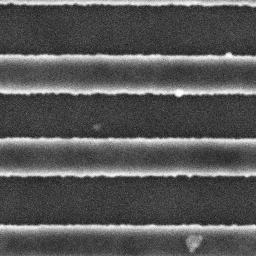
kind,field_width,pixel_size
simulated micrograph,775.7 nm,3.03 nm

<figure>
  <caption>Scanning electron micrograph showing lines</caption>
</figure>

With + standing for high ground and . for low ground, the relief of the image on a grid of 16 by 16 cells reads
................
................
................
++++++++++....+.
++++++++++++++++
++++++++++++++++
................
................
................
++++++++++++++++
++++++++++++++++
................
................
................
++++++++++++++++
++++++++++++++++